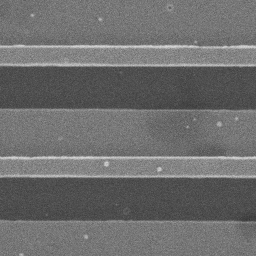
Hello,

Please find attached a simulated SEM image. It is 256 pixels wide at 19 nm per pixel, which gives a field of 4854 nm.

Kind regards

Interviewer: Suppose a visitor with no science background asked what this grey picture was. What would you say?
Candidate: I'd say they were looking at lines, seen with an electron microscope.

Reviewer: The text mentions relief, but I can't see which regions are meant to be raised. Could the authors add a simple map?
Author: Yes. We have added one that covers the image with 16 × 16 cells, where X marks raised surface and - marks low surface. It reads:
XXXXXXXXXXXXXXXX
XXXXXXXXXXXXXXXX
XXXXXXXXXXXXXXXX
XXXXXXXXXXXXXXXX
----------------
----------------
----------------
XXXXXXXXXXXXXXXX
XXXXXXXXXXXXXXXX
XXXXXXXXXXXXXXXX
XXXXXXXXXXXXXXXX
----------------
----------------
----------------
XXXXXXXXXXXXXXXX
XXXXXXXXXXXXXXXX